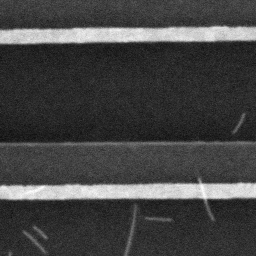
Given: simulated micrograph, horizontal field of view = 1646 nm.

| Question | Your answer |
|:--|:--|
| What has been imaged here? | lines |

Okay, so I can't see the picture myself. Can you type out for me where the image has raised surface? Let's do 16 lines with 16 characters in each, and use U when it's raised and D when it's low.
UUUUUUUUUUUUUUUU
UUUUUUUUUUUUUUUU
UUUUUUUUUUUUUUDD
DDDDDDDDDDDDDDDD
DDDDDDDDDDDDDDDD
DDDDDDDDDDDDDDDD
DDDDDDDDDDDDDDDD
DDDDDDDDDDDDDDDD
DDDDDDDDDDDDDDDD
UUUUUUUUUUUUUUUU
UUUUUUUUUUUUUUUU
UUUUUUUUUUUUUUUU
DDDDDDDDDDDDDDDD
DDDDDDDDDDDDDDDD
DDDDDDDDDDDDDDDD
DDDDDDDDDDDDDDDD